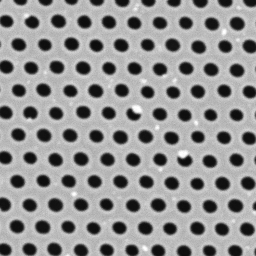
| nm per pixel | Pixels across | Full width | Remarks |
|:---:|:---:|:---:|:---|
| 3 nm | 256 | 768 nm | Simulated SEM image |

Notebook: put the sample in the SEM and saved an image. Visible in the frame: a regular array of holes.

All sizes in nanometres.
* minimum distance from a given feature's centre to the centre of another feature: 75.4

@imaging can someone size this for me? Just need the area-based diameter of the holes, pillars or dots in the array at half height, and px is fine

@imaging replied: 13.4